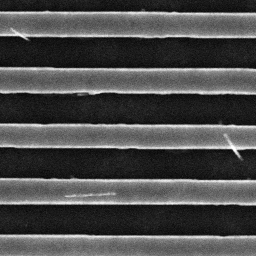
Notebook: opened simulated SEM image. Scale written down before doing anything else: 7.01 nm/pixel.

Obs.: lines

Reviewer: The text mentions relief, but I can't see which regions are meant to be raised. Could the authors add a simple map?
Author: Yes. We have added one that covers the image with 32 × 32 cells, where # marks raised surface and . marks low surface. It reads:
................................
................................
################################
################################
..##############################
................................
................................
................................
######..........................
################################
################################
################################
................................
................................
................................
................................
################################
################################
..............##.###############
................................
................................
................................
########################........
################################
################################
.............................###
................................
................................
................................
###########.....................
################################
################################